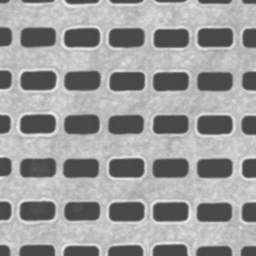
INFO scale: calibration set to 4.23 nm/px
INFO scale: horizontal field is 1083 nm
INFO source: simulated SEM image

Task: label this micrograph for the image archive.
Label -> a regular array of holes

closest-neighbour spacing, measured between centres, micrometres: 0.183